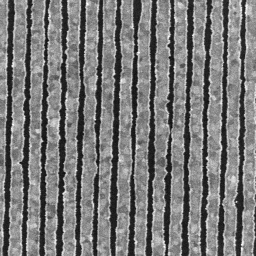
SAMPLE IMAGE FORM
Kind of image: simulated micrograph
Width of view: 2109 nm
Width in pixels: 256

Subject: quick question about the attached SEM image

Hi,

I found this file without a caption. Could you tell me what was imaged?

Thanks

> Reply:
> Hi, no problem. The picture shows parallel lines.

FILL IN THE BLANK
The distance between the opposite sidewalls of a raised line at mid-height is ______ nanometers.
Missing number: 92.7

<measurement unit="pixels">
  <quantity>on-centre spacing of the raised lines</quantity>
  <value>17.9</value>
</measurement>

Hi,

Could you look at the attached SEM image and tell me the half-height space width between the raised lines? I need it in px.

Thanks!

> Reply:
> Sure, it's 6.5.